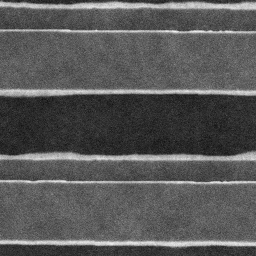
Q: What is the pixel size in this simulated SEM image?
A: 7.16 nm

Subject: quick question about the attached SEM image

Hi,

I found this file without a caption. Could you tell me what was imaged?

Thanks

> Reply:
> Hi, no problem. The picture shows lines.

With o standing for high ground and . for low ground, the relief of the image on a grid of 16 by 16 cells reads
oooooooooooooooo
oooooooooooooooo
oooooooooooooooo
oooooooooooooooo
oooooooooooooooo
oooooooooooooooo
................
................
................
................
oooooooooooooooo
oooooooooooooooo
oooooooooooooooo
oooooooooooooooo
oooooooooooooooo
................